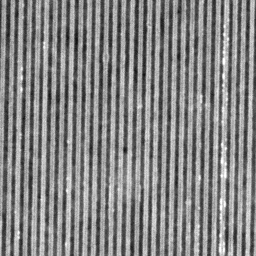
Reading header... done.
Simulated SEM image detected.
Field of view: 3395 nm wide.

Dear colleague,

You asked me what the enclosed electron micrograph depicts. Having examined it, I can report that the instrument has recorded parallel lines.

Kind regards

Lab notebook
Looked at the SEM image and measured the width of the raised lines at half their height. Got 46.4 nanometres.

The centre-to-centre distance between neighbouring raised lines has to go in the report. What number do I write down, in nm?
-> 114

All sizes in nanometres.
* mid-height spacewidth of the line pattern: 69.6